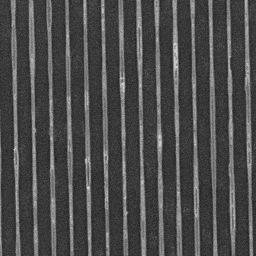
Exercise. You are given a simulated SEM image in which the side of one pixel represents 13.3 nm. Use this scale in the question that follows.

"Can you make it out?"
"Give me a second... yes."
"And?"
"parallel lines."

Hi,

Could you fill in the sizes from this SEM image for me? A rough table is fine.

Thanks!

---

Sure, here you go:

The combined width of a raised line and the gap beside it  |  238 nm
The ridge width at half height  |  39.8 nm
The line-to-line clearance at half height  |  14.9 px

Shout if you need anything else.